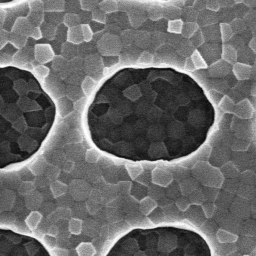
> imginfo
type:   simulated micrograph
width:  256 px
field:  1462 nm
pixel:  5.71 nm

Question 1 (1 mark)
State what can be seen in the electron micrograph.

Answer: holes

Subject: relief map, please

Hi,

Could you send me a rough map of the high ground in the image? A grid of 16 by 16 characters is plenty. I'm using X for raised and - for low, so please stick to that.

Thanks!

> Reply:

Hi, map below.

XXXXXXXXXXXXXXXX
XXXXXXXXXXXXXXXX
XXXXXXXXXXXXXXXX
XXXXXXXXXXXXXXXX
--XXXXX----XXXXX
---XXX-------XXX
---XX--------XXX
---XX--------XXX
---XXX-------XXX
--XXXX------XXXX
XXXXXXXXXXXXXXXX
XXXXXXXXXXXXXXXX
XXXXXXXXXXXXXXXX
XXXXXXXXXXXXXXXX
-XXXXXXX----XXXX
---XXXX------XXX